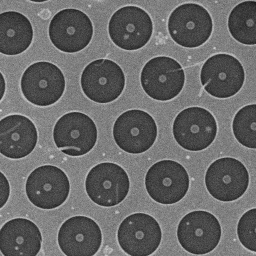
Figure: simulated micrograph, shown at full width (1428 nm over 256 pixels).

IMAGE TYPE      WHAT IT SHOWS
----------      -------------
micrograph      an array of small figures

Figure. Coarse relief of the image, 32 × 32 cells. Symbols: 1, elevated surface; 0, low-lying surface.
11111111111111111111111001111100
10111110001111000011110000111000
00001100000111000001100000111000
00001100000011001001100000011000
00001100000011000001100000111000
00001110000111000011110001111110
00011111001111111111111111111111
11111111111100111110001111000011
11100001111000011100000110000011
11100000110000001100000110000001
01100100110000001100000110000011
01100000110000011100000111000011
11100001111000111111011111111111
11111111111111111111111001111100
10011111000111100001110000011000
00001110000011000001110000011000
00000110010011001000110000011000
00000110000011000001110000011100
00001111000011100001111000111110
10011111101111111111111111111111
11111111111100111110001111000011
11110000111000001100000111000001
01100000011000001100000011001001
01100000011000001100000011000001
01100000111000001110000111100011
01110000111100011111111111111111
11111111111111111111111100111110
10001111000011100001111000011100
00000111000011100000110000001100
00000110000001100100110000001100
00000110000001100000111000011100
00000111000011110001111100111111